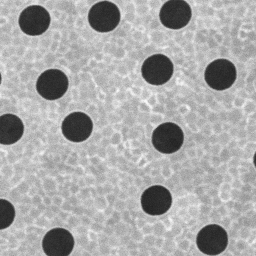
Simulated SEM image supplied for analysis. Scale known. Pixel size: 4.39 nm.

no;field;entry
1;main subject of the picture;holes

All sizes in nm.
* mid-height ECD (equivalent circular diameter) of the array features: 141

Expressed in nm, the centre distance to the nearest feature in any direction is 278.